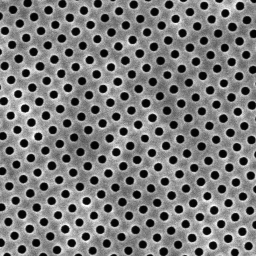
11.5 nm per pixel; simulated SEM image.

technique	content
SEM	a regular array of holes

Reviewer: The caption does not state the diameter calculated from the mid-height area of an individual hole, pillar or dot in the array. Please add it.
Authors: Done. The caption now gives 0.0973 microns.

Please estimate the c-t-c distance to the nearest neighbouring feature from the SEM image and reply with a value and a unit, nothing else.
178 nanometres